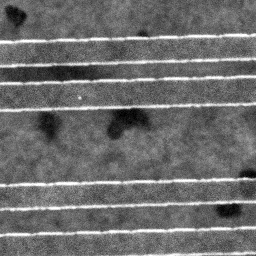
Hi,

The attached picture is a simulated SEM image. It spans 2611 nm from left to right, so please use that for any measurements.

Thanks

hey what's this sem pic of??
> lines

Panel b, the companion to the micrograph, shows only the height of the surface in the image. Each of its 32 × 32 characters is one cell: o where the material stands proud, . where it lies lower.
................................
................................
................................
................................
...........................ooooo
oooooooooooooooooooooooooooooooo
oooooooooooooooooooooooooooooooo
oooooooooooooooooooooooooooo....
................................
................................
oooooooooooooooooooooooooooooooo
oooooooooooooooooooooooooooooooo
oooooooooooooooooooooooooooooooo
ooooooooooo.....................
................................
................................
................................
................................
................................
................................
................................
................................
.............................ooo
oooooooooooooooooooooooooooooooo
oooooooooooooooooooooooooooooooo
ooooooooooooooooooooooooo.......
................................
................................
................................
oooooooooooooooooooooooooooooooo
oooooooooooooooooooooooooooooooo
oooooooooooooooooooooooooooooooo